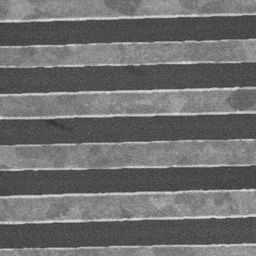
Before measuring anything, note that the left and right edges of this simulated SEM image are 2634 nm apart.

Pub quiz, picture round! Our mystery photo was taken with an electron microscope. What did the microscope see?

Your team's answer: lines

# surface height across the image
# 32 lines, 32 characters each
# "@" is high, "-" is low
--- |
@@@@@@@@@@@@@@@@@@@@@@@@@@@@@@@@
@@@@@@@@@@@@@@@@@@@@@@@@@@@@@@@@
@@@@@@--------------------------
--------------------------------
--------------------------------
--------------@@@@@@@@@@@@@@@@@@
@@@@@@@@@@@@@@@@@@@@@@@@@@@@@@@@
@@@@@@@@@@@@@@@@@@@@@@@@@@@@@@@@
--------------------------------
--------------------------------
--------------------------------
----------@@@@@@@@@@@@@@@@@@@@@@
@@@@@@@@@@@@@@@@@@@@@@@@@@@@@@@@
@@@@@@@@@@@@@@@@@@@@@@@@@@@@@@@@
@@@@@@@@@@@@@-------------------
--------------------------------
--------------------------------
----------------------------@@@@
@@@@@@@@@@@@@@@@@@@@@@@@@@@@@@@@
@@@@@@@@@@@@@@@@@@@@@@@@@@@@@@@@
@@@@@@@@@@@@@@@@@@@@@@@@@@@@@@@@
--------------------------------
--------------------------------
--------------------------------
-@@@@@@@@@@@@@@@@@@@@@@@@@@@@@@@
@@@@@@@@@@@@@@@@@@@@@@@@@@@@@@@@
@@@@@@@@@@@@@@@@@@@@@@@@@@@@@@@@
@@@@@@@@@@@@@-------------------
--------------------------------
--------------------------------
--------------------------------
@@@@@@@@@@@@@@@@@@@@@@@@@@@@@@@@